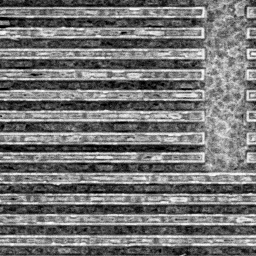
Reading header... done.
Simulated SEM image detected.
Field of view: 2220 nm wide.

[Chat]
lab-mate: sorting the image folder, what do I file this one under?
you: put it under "parallel lines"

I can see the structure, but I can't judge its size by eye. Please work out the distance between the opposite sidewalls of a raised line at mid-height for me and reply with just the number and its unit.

82.4 nm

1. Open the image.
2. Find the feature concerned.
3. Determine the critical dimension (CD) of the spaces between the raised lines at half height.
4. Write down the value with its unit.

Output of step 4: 0.0965 micrometres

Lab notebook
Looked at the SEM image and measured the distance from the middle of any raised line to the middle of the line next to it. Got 0.18 micrometres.